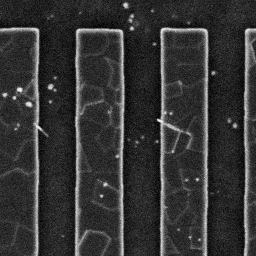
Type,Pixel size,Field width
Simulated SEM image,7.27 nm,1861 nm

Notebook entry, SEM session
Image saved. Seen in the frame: wiring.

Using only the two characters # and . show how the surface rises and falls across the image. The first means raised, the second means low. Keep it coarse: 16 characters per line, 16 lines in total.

................
................
##...###..###..#
##...###..###..#
##...###..###..#
##...###..###..#
##...###..###..#
##...###..###..#
##...###..###..#
##...###..###..#
##...###..###..#
##...###..###..#
##...###..###..#
##...###..###..#
##...###..###..#
##...###..###..#